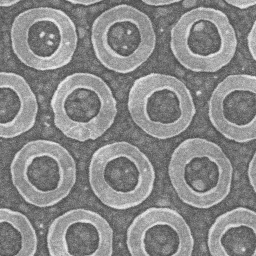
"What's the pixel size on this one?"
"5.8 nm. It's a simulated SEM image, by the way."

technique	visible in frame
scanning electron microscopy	a regular array of ring-shaped raised bodies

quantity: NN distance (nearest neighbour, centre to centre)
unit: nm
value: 446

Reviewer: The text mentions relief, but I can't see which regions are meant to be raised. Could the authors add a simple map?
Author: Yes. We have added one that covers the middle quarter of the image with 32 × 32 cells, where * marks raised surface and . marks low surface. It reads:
...........*******............**
.............****...............
................................
.********...........********....
**********........***********...
***********.......************..
**.....****......*******...****.
*.......****.....*****......***.
.........***....*****........***
.........****...****.........***
..........***...****.........***
.........****...****.........***
*.......*****....****........***
*.......****.....****........***
***...******......*****.....***.
****.******........************.
*.....****..........**********..
......****...........*******....
.......*................*.......
..............................**
..........*******............***
*........**********.........****
*.......************.......*****
**.....******...****.......*****
***....****......****......****.
***....***........****....****..
***....***.........***....****..
***....***.........***....****..
***....***.........***.....***..
***....***.........***.....***..
**.....****.......****.....****.
**.....******.....****......****